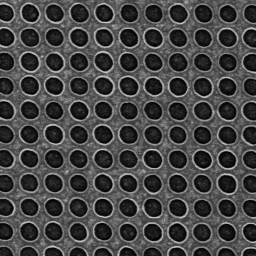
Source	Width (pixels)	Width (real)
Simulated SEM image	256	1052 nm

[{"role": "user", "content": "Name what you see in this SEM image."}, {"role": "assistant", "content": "a regular array of holes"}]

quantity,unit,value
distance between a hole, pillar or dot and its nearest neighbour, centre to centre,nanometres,98.2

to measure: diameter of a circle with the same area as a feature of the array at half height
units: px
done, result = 18.2